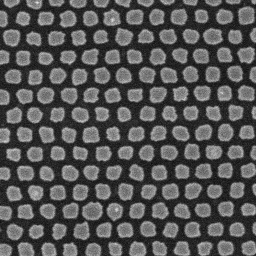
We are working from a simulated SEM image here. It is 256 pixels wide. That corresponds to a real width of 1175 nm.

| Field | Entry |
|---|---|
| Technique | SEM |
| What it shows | a regular array of raised bodies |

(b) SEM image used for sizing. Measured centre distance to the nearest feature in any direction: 0.0985 microns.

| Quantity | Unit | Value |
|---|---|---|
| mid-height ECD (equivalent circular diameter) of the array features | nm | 69.7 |